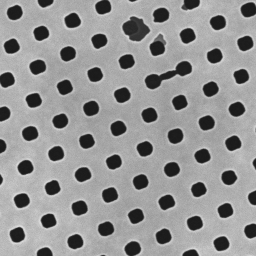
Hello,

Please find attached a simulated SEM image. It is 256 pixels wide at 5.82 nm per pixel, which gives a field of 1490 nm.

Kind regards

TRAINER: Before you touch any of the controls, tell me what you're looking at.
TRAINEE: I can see a regular array of holes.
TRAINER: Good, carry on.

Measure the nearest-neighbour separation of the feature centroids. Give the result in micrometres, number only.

0.193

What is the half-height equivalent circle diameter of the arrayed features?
89.1 nm